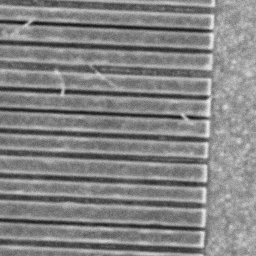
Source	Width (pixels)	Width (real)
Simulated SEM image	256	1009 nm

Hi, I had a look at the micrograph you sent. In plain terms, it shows parallel lines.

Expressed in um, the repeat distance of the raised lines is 0.0852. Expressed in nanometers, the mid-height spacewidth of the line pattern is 26.5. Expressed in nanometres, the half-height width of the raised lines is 59.5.